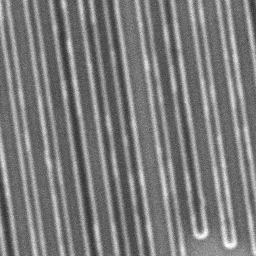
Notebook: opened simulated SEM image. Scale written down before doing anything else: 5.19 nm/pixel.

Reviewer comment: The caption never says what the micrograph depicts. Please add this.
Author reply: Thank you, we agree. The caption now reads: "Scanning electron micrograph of parallel lines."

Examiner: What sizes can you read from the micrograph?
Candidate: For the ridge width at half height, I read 61.6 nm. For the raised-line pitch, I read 141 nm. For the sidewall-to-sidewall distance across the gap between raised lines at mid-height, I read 15.7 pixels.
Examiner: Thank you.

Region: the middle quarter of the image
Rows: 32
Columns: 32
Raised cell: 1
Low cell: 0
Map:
11000011100011110000111000111100
11100011110011110000011000011100
11100001110001110000011000011100
11100001110001110000011100011100
11100001110001110000011100011100
11100001110001110000011100011100
11100001110001110000011100011100
11100001110000111000011100011110
11110001111000111000001100001110
11110000111000111000001100001110
11110000111000111000001110001110
01110000111000111000001110001110
01110000111000111000001110001110
01110000111000111100001110001111
01110000111000111100000110001111
01111000111100111100000110000111
01111000011100011100000110000111
01111000011100011100000111000111
01111000011100011100000111000111
00111000011100011100000111000111
00111000011100011110000111000111
00111000011100001110000011000011
00111100001110001110000011000011
00111100001110001110000011000011
00111100001110001110000011100011
00111100001110001110000011100011
00011100001110001110000011100011
00011100001110001111000011100011
00011110001110001111000001100001
00011110000111000111000001100001
00011110000111000111000001100001
00011110000111000111000001110001